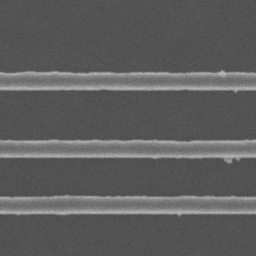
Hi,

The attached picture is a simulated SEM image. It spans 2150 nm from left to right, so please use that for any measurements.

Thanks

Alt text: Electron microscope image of lines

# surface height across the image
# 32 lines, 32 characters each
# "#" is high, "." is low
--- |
................................
................................
................................
................................
................................
................................
................................
................................
................................
################################
################################
................................
................................
................................
................................
................................
................................
................................
################################
################################
................................
................................
................................
................................
........#.......................
################################
################################
................................
................................
................................
................................
................................